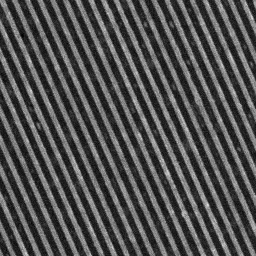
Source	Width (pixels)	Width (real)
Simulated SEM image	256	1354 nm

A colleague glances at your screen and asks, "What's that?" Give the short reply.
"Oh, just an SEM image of parallel lines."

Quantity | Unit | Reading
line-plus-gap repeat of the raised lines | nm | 61.3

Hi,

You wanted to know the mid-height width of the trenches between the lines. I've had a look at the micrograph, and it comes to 41.1 nm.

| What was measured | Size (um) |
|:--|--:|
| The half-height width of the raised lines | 0.0205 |